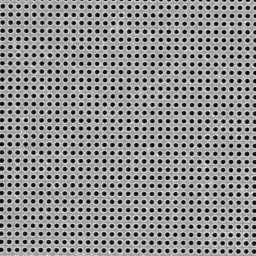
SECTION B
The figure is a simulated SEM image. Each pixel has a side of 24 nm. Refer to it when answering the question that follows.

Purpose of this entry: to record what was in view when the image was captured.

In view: a regular array of holes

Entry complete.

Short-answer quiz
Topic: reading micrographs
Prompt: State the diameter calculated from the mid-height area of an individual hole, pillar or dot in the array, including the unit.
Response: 0.121 microns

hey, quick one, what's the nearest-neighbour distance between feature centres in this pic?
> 180 nm